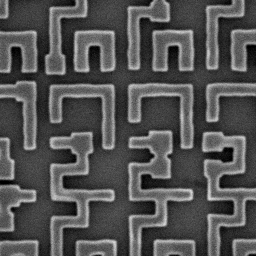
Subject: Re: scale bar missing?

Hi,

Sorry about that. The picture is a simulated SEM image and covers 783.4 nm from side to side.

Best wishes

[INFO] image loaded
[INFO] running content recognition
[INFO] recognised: wiring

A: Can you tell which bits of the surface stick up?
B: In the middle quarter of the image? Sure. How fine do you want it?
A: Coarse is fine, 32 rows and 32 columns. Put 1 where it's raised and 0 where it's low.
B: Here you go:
00011100011110001110001111000111
00011100011100000000000111000000
00000000000000000000000000000000
00000000000000000000000000000000
00000000000000000000000000000000
11111111111100001111111111111111
11111111111100001111111111111111
11111111111100001111111111111111
00000000011100001110000000000111
00000000001100001110000000000111
00000000001100001110000000000111
00000000001100001110000000000111
00000000001100001110000000000111
00000000001100001110000000000111
00000000001100001110000000000111
00000000001100000000000000000111
00000000001100000000000000000111
00111110001100000000011111100111
11111110001100000111111111100111
11111110001100001111111111100111
11111110001100001111111111100111
00111110000000000000011111100000
00111100000000000000001111000000
00011100000000000000001111000000
00011100000000000000001111100000
11111100000000001111111111100000
11111100000000001111111111100000
11111100000000001111011111100000
00000000000000001110000011000000
00000000000000001110000000000000
00000000000000001110000000000000
11100000000000001111111111111111